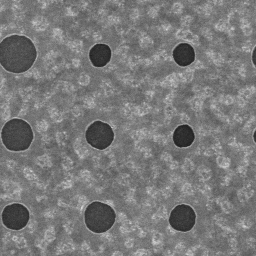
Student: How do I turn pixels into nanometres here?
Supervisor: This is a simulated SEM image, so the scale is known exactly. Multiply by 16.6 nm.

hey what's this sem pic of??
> a regular array of holes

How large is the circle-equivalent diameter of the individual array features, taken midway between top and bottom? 454 nanometres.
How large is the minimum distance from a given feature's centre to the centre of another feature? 1.35 micrometres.